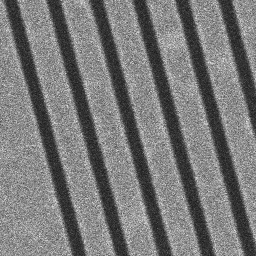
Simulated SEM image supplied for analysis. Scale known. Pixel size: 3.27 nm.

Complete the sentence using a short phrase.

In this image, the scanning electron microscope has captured parallel lines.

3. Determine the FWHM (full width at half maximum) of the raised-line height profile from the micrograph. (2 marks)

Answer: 90.4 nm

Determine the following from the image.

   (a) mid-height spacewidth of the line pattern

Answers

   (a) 13.7 pixels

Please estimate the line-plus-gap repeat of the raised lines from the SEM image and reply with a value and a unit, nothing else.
135 nm